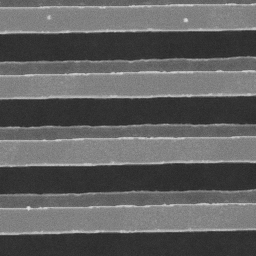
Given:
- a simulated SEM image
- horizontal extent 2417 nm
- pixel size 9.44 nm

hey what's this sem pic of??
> lines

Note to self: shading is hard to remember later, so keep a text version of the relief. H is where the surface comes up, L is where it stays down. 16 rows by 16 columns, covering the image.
HHHHHHHHHHHHHHHH
HHHHHHHHHHHHHHHH
LLLLLLLLLLLLLLLL
LLLLLLLLLLLLLLLL
HHHHHHHHHHHHHHHH
HHHHHHHHHHHHHHHH
LLLLLLLLLLLLLLLL
LLLLLLLLLLLLLLLL
HHHHHHHHHHHHHHHH
HHHHHHHHHHHHHHHH
LLLLLLLLLLLLLLLL
LLLLLLLLLLLLLLLL
HHHHHHHHHHHHHHHH
HHHHHHHHHHHHHHHH
HHHHHHHHHLLLLLLL
LLLLLLLLLLLLLLLL